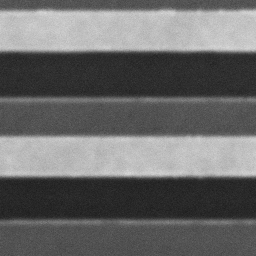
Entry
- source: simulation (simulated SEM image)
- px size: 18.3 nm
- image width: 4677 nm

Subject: lines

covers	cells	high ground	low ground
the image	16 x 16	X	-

XXXXXXXXXXXXXXXX
XXXXXXXXXXXXXXXX
XXXXXXXXXXXXXXXX
----------------
----------------
----------------
XXXXXXXXXXXXXXXX
XXXXXXXXXXXXXXXX
XXXXXXXXXXXXXXXX
XXXXXXXXXXXXXXXX
XXXXXXXXXXXXXXXX
----------------
----------------
----------------
XXXXXXXXXXXXXXXX
XXXXXXXXXXXXXXXX